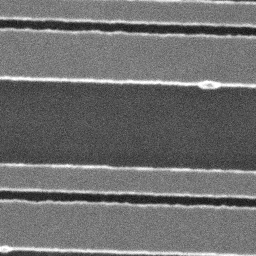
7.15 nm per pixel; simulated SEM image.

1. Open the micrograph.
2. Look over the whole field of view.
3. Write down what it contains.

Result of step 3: lines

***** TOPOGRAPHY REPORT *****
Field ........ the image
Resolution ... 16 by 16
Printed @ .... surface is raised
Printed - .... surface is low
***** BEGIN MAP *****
@@@@@@@@@@@@@@@@
@@@@@@@@@@@@@@@@
@@@@@@@@@@@@@@@@
@@@@@@@@@@@@@@@@
@@@@@@@@@@@@@@@@
----------------
----------------
----------------
----------------
----------------
@@@@@@@---------
@@@@@@@@@@@@@@@@
@@@@@@@@@@@@@@@@
@@@@@@@@@@@@@@@@
@@@@@@@@@@@@@@@@
@@@@@@@@@@@@@@@@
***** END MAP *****